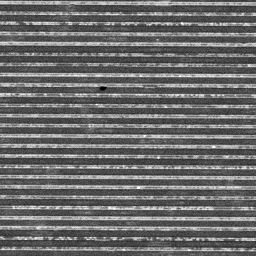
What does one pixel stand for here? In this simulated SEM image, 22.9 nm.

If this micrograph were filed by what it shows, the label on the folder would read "parallel lines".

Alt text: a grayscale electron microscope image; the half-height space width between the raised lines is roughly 169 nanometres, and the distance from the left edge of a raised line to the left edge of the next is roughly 234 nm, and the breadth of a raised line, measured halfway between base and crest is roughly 62.9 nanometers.